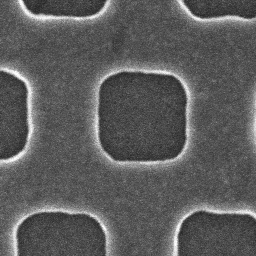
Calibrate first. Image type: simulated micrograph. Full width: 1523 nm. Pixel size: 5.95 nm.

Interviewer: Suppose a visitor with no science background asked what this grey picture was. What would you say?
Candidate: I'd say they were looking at holes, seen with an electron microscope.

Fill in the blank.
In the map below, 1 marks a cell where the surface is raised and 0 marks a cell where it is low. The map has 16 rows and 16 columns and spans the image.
1100001111110000
1111111111111111
1111111111111111
1111111111111111
0111111101111111
0011110000001111
0011110000001111
0011110000001111
0011110000001111
0111111000011111
1111111111111111
1111111111111111
1111111111111111
1100001111110000
1000000111100000
1000000111100000